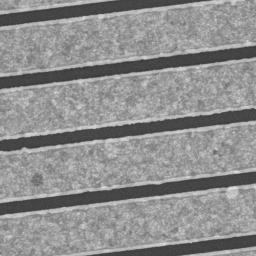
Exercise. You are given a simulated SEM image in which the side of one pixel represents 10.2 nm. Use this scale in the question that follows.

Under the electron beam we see one or a few lines or trenches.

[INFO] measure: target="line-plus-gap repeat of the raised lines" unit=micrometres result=0.638